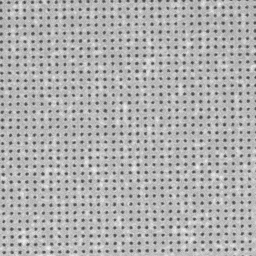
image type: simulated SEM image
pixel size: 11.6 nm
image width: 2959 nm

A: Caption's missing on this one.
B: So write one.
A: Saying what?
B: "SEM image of a regular array of holes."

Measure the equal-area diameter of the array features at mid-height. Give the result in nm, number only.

43.3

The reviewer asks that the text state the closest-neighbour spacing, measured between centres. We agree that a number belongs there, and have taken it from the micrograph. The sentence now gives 88 nanometers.